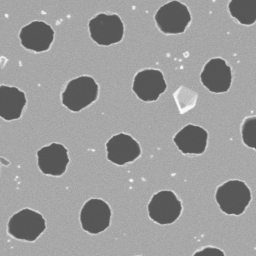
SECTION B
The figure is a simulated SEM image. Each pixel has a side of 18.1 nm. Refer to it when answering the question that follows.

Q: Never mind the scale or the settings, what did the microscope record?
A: a regular array of holes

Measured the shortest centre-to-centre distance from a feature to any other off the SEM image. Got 69.3 px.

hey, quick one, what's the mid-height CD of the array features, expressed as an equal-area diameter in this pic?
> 588 nanometers